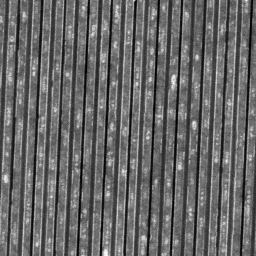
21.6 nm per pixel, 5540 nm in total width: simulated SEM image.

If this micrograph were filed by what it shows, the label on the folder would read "parallel lines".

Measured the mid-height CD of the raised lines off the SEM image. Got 165 nm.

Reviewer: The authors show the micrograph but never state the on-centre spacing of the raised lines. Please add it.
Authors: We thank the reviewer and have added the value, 252 nanometers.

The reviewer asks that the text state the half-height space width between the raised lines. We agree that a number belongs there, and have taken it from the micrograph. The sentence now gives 83.8 nanometres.